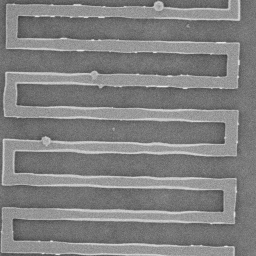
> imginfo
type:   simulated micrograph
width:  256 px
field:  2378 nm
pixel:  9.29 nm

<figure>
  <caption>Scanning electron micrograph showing groups of lines, slits or small figures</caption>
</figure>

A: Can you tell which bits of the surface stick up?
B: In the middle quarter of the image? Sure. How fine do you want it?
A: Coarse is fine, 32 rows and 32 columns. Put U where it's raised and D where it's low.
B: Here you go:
DDDDDDDDDDDDDDDDDDDDDDDDDDDDDDDD
DDDDDDDDDDDDDDDDDDDDDDDDDDDDDDDD
DDDDDDUUUDDDDDDDDDDDDDDDDDDDDDDD
UUUUUUUUUUUUUUUUUUUUUUUUUUUUUUUU
UUUUUUUUUUUUUUUUUUUUUUUUUUUUUUUU
DDDDDDDDDUDDDDDDDDDDDDDDDDDUUUUU
DDDDDDDDDDDDDDDDDDDDDDDDDDDDDDDD
DDDDDDDDDDDDDDDDDDDDDDDDDDDDDDDD
DDDDDDDDDDDDDDDDDDDDDDDDDDDDDDDD
DDDDDDDDDDDDDDDDDDDDDDDDDDDDDDDD
DDDDDDDDDDDDDDDDDDDDDDDDDDDDDDDD
UUUUUUUUUUUUUUUUUUUUUDDDDDDDDDDD
UUUUUUUUUUUUUUUUUUUUUUUUUUUUUUUU
DDDDDDDDUUUUUUUUUUUUUUUUUUUUUUUU
DDDDDDDDDDDDDDDDDDDDDDDDDDDDDDDD
DDDDDDDDDDDDDDDDDDDDDDDDDDDDDDDD
DDDDDDDDDDDDDDDDDDDDDDDDDDDDDDDD
DDDDDDDDDDDDDDDDDDDDDDDDDDDDDDDD
DDDDDDDDDDDDDDDDDDDDDDDDDDDDDDDD
DDDDDDDDDDDDDDDDDDDDDDDDDDDDDDDD
UUUUUUUUUUUUUUUUUUUUUUUUUUUDDDDD
UUUUUUUUUUUUUUUUUUUUUUUUUUUUUUUU
DDDDDDDDDDDDDDDDDDDDDDDDDDDDDDDD
DDDDDDDDDDDDDDDDDDDDDDDDDDDDDDDD
DDDDDDDDDDDDDDDDDDDDDDDDDDDDDDDD
DDDDDDDDDDDDDDDDDDDDDDDDDDDDDDDD
DDDDDDDDDDDDDDDDDDDDDDDDDDDDDDDD
DDDDDDDDDDDDDDDDDDDDDDDDDDDDDDDD
UUUUUUUUUUUUUUUUUUUUUUDDDDDDDDDD
UUUUUUUUUUUUUUUUUUUUUUUUUUUUUUUU
DDDDDDDDUUUUUUUUUUUUUUUUUUUUUUUU
DDDDDDDDDDDDDDDDDDDDDDDDDDDDDDDD